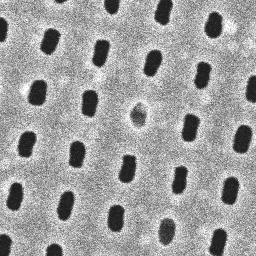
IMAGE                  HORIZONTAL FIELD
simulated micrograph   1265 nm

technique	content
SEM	a regular array of holes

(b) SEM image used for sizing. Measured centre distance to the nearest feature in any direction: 0.255 micrometres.